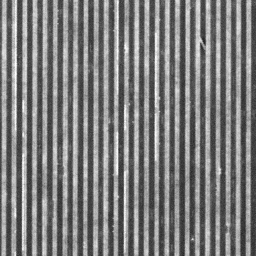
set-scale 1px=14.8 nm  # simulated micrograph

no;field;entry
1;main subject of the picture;parallel lines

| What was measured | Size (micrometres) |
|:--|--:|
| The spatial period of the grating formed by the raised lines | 0.151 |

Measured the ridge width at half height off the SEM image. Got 0.0592 micrometres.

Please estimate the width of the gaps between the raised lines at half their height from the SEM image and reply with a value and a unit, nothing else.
88.8 nm